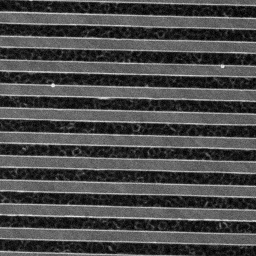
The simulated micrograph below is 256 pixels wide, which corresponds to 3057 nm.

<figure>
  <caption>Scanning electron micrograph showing parallel lines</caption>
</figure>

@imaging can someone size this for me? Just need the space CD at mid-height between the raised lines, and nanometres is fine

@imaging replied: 125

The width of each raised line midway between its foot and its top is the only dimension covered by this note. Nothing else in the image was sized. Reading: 161 nm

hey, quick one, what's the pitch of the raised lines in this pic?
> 286 nm